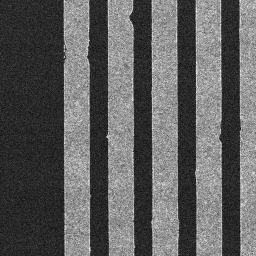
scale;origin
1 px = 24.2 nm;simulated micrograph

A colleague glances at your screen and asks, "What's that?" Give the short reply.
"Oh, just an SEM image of parallel lines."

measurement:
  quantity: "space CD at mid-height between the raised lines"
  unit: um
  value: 0.46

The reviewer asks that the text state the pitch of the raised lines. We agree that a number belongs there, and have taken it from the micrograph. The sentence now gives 1060 nanometres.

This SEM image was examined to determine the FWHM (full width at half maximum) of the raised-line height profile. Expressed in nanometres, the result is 593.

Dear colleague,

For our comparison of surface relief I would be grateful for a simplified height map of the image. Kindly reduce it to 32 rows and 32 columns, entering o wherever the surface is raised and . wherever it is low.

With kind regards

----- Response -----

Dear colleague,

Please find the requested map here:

........ooo...ooo..ooo...ooo..oo
........ooo...oo...ooo...ooo..oo
.........oo...oo...ooo...ooo..oo
........ooo...ooo..ooo...ooo..oo
........ooo...ooo..ooo...ooo..oo
........ooo...ooo..ooo...ooo..oo
........ooo...ooo..ooo...ooo..oo
........ooo...ooo..ooo...ooo..oo
........ooo...ooo..ooo...ooo..oo
........ooo...ooo..ooo...ooo..oo
........ooo...ooo..ooo...ooo..oo
........ooo...ooo..ooo...ooo..oo
........ooo...ooo..ooo...ooo..oo
........ooo...ooo..ooo...ooo..oo
........ooo...ooo..ooo...ooo..oo
..........o...ooo..ooo...ooo..oo
........ooo...ooo..ooo...oo...oo
........ooo...ooo..ooo...oo...oo
........ooo........ooo...ooo..oo
........ooo.....o..ooo...ooo..oo
........ooo...ooo..ooo...ooo..oo
........o.o...ooo..ooo...ooo..oo
........oo.....oo..o.o...ooo..oo
........ooo....oo..ooo...ooo..oo
........ooo...ooo..ooo...ooo..oo
........ooo...ooo..ooo...ooo...o
........ooo...ooo..ooo...ooo..oo
........ooo...ooo..o.o...ooo..oo
........ooo...ooo..ooo....oo..oo
........ooo...ooo..ooo...ooo..oo
........ooo...ooo..ooo...ooo..oo
........ooo...ooo..ooo...ooo..oo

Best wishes